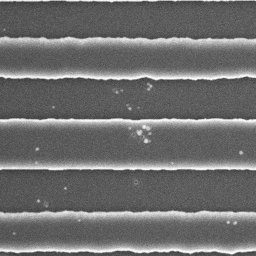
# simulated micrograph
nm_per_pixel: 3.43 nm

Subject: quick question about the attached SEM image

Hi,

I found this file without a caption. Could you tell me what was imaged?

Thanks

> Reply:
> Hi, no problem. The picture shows lines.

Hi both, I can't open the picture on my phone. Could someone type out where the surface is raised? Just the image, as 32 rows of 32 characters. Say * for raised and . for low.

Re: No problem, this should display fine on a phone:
................................
................................
................................
................................
................................
********************************
********************************
********************************
********************************
********************************
................................
................................
................................
................................
................................
********************************
********************************
********************************
********************************
********************************
********************************
................................
................................
................................
................................
................................
................................
********************************
********************************
********************************
********************************
............*..........*....**..